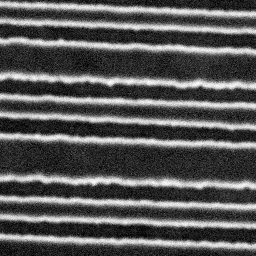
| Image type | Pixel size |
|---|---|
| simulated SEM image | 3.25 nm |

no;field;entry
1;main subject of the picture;lines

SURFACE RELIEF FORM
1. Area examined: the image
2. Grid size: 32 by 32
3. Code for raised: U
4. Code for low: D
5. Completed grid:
UUDDDDDDDDDDDDDDDDDDDDDDDDDDDDDD
UUUUUUUUUUUUUUUUUUUUUUUUUUDDDDDD
UUUUUUUUUUUUUUUUUUUUUUUUUUUUUUUU
DDDDDDDDDDDDDDDUUUUUUUUUUUUUUUUU
DDDDDDDDDDDDDDDDDDDDDDDDDDDDDDDD
UUUUUUUUUUUUUDDDDDDDDDDDDDDDDDDD
UUUUUUUUUUUUUUUUUUUUUUUUUUUUUUUU
UUUUUUUUUUUUUUUUUUUUUUUUUUUUUUUU
UUUUUUUUUUUUUUUUUUUUUUUUUUUUUUUU
UUUUUUUUUUUUUUUUUUUUUUUUUUUUUUUU
DDDDDDDDDDDDDDDDDDDDDUUUUUUUUUUU
DDDDDDDDDDDDDDDDDDDDDDDDDDDDDDDD
UUUUUUUUUUUUUUUUDDDDDDDDDDDDDDDD
UUUUUUUUUUUUUUUUUUUUUUUUUUUUUUUU
DUUUUUUUUUUUUUUUUUUUUUUUUUUUUUUU
DDDDDDDDDDDDDDDDDDDDDUUUUUUUUUUU
DDDDDDDDDDDDDDDDDDDDDDDDDDDDDDDD
UUUUUUUUUUUUUUUUUUDDDDDDDDDDDDDD
UUUUUUUUUUUUUUUUUUUUUUUUUUUUUUUU
UUUUUUUUUUUUUUUUUUUUUUUUUUUUUUUU
UUUUUUUUUUUUUUUUUUUUUUUUUUUUUUUU
UUUUUUUUUUUUUUUUUUUUUUUUUUUUUUUU
DDUUDUUUUUUUUUUUUUUUUUUUUUUUUUUU
DDDDDDDDDDDDDDDDDDDDDDDDDDDDDDDD
DDDDDDDDDDDDDDDDDDDDDDDDDDDDDDDD
UUUUUUUUUUUUUUUUUUUUUUUUUDDDDDDD
UUUUUUUUUUUUUUUUUUUUUUUUUUUUUUUU
DDDUUUUUUUUUUUUUUUUUUUUUUUUUUUUU
DDDDDDDDDDDDDDDDDDDDDDDDDDDDDDDD
UDDDDDDDDDDDDDDDDDDDDDDDDDDDDDDD
UUUUUUUUUUUUUUUUUUUUUUUUUUUUDDDD
UUUUUUUUUUUUUUUUUUUUUUUUUUUUUUUU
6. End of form